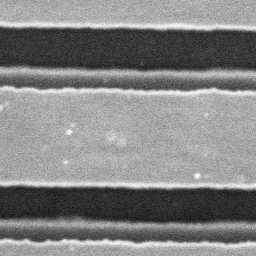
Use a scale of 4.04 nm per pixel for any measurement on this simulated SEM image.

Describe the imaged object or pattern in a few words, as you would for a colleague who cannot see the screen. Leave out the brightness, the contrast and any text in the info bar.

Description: lines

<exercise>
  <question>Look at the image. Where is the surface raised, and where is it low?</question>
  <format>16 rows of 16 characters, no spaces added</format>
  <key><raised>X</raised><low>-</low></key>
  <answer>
XXXXXXXXXXXXXXXX
XXXXXXXXXXXXXXXX
----------------
----------------
----------------
X---------------
XXXXXXXXXXXXXXXX
XXXXXXXXXXXXXXXX
XXXXXXXXXXXXXXXX
XXXXXXXXXXXXXXXX
XXXXXXXXXXXXXXXX
XXXXXXXXXXXXXXXX
----------------
----------------
----------------
XXXXXXXXXXXXXXXX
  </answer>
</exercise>